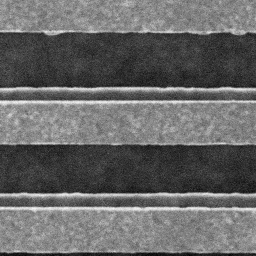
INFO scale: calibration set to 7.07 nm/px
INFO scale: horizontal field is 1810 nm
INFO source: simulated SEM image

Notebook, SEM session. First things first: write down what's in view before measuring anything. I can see lines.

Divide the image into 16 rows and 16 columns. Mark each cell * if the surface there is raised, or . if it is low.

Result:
****************
****************
................
................
................
........*.......
****************
****************
****************
................
................
................
****************
****************
****************
****************